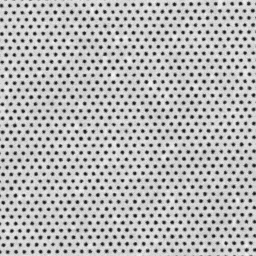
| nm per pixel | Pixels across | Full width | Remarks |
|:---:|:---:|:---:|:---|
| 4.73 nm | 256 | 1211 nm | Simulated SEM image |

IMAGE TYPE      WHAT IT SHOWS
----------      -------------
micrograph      a regular array of holes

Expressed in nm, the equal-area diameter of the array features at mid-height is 17.7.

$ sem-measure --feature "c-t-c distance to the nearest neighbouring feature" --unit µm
0.0364